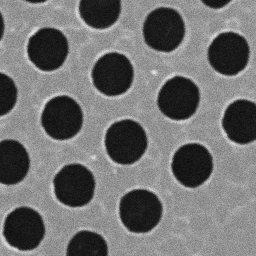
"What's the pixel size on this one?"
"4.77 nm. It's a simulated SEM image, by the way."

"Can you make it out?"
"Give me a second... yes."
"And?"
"a regular array of holes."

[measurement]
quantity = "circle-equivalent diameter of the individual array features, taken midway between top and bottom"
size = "204 nm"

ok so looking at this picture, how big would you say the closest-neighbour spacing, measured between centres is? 321 nm